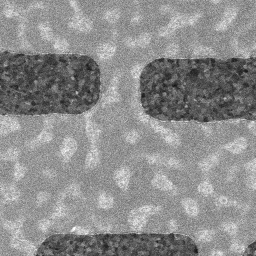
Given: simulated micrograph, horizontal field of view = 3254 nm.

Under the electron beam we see raised bodies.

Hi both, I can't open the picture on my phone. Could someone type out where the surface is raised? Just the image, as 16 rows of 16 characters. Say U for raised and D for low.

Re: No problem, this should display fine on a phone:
DDDDDDDDDDDDDDDD
DDDDDDDDDDDDDDDD
DDDDDDDDDDDDDDDD
UUUUUDDDDDDDDDDD
UUUUUUDDDUUUUUUU
UUUUUUDDDUUUUUUU
UUUUUUDDDUUUUUUU
DDDDDDDDDDUUUUDU
DDDDDDDDDDDDDDDD
DDDDDDDDDDDDDDDD
DDDDDDDDDDDDDDDD
DDDDDDDDDDDDDDDD
DDDDDDDDDDDDDDDD
DDDDDDDDDDDDDDDD
DDDDDDDDDDDDDDDD
DDUUUUUUUUUUDDDU